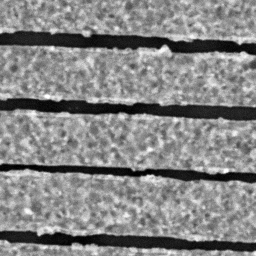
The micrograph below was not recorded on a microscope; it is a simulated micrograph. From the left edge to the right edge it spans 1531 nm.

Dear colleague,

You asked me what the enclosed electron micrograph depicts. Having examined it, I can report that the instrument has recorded one or a few lines or trenches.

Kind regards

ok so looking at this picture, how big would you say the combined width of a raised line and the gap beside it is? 389 nanometres